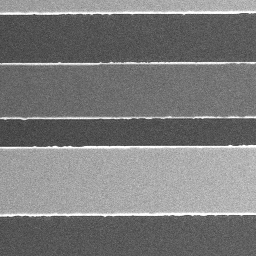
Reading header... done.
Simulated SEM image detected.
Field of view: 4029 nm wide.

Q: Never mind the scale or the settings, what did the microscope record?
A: lines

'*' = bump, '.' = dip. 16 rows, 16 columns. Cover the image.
****************
................
................
................
****************
****************
****************
................
................
****************
****************
****************
****************
................
................
................